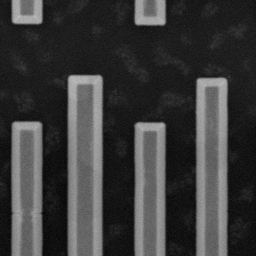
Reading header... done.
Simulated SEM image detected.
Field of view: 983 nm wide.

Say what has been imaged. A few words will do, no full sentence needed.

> one or a few lines or trenches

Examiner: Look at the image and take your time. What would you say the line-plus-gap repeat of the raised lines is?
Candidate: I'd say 236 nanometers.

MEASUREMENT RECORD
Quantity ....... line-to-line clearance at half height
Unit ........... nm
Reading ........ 149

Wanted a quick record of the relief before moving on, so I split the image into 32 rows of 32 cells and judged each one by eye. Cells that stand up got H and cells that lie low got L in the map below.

LLHHHLLLLLLLLLLLLHHHLLLLLLLLLLLL
LLHHHLLLLLLLLLLLLHHHLLLLLLLLLLLL
LLLLLLLLLLLLLLLLLLHHLLLLLLLLLLLL
LLLLLLLLLLLLLLLLLLLLLLLLLLLLLLLL
LLLLLLLLLLLLLLLLLLLLLLLLLLLLLLLL
LLLLLLLLLLLLLLLLLLLLLLLLLLLLLLLL
LLLLLLLLLLLLLLLLLLLLLLLLLLLLLLLL
LLLLLLLLLLLLLLLLLLLLLLLLLLLLLLLL
LLLLLLLLLLLLLLLLLLLLLLLLLLLLLLLL
LLLLLLLLLLLLLLLLLLLLLLLLLLLLLLLL
LLLLLLLLLHHHLLLLLLLLLLLLLHHHLLLL
LLLLLLLLLHHHLLLLLLLLLLLLLHHHLLLL
LLLLLLLLLHHHLLLLLLLLLLLLLHHHLLLL
LLLLLLLLLHHHLLLLLLLLLLLLLHHHLLLL
LLLLLLLLLHHHLLLLLLLLLLLLLHHHLLLL
LLLLLLLLLHHHLLLLLLLLLLLLLHHHLLLL
LLHHHLLLLHHHLLLLLHHHLLLLLHHHLLLL
LLHHHLLLLHHHLLLLLHHHLLLLLHHHLLLL
LLHHHLLLLHHHLLLLLHHHLLLLLHHHLLLL
LLHHHLLLLHHHLLLLLHHHLLLLLHHHLLLL
LLHHHLLLLHHHLLLLLHHHLLLLLHHHLLLL
LLHHHLLLLHHHLLLLLHHHLLLLLHHHLLLL
LLHHHLLLLHHHLLLLLHHHLLLLLHHHLLLL
LLHHHLLLLHHHLLLLLHHHLLLLLHHHLLLL
LLHHHLLLLHHHLLLLLHHHLLLLLHHHLLLL
LLHHHLLLLHHHLLLLLHHHLLLLLHHHLLLL
LLHHHLLLLHHHLLLLLHHHLLLLLHHHLLLL
LLHHHLLLLHHHLLLLLHHHLLLLLHHHLLLL
LLHHHLLLLHHHLLLLLHHHLLLLLHHHLLLL
LLHHHLLLLHHHLLLLLHHHLLLLLHHHLLLL
LLHHHLLLLHHHLLLLLHHHLLLLLHHHLLLL
LLHHHLLLLHHHLLLLLHHHLLLLLHHHLLLL